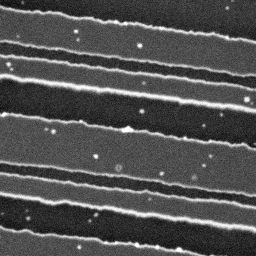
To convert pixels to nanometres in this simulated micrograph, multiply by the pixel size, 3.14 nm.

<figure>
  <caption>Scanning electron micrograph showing lines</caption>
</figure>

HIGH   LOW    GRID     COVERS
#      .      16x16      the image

................
#########.......
###############.
################
################
......##########
.............###
###.............
###########.....
################
################
################
..##############
..........######
##..............
##########......